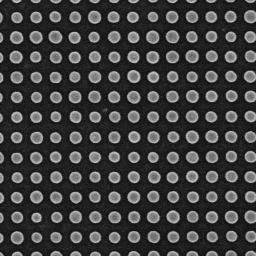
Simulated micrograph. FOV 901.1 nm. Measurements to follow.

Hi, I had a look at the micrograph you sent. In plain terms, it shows a regular array of raised bodies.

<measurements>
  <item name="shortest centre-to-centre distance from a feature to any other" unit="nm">67.4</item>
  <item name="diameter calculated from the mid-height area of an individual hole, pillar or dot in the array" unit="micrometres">0.039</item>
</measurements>